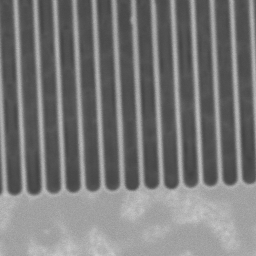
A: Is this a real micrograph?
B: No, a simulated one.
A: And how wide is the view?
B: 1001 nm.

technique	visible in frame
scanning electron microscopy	parallel lines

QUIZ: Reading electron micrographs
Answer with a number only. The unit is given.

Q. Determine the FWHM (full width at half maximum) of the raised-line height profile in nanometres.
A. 22.5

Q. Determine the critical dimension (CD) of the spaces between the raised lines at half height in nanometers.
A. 56.1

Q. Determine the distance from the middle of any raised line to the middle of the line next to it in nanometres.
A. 76.7